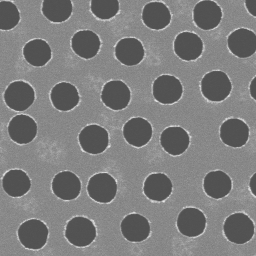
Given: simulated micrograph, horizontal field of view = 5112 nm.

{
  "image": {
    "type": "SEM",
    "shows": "a regular array of holes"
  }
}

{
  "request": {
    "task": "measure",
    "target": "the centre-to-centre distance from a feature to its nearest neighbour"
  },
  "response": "895 nm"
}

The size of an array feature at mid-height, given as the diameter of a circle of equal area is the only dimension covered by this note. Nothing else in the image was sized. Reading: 582 nanometres